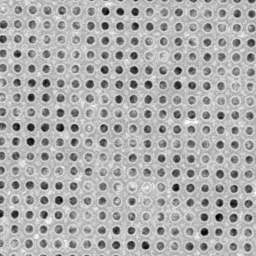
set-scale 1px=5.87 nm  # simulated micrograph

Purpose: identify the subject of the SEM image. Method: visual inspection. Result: a regular array of holes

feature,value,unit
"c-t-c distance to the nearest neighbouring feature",84.1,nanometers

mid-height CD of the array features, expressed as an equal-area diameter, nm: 52.5